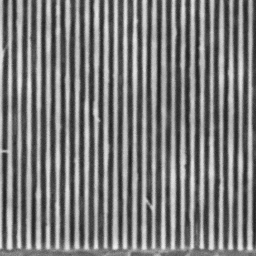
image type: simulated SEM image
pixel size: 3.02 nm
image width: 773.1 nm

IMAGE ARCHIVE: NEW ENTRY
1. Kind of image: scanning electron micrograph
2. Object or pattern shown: parallel lines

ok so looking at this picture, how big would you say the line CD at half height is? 11.3 nm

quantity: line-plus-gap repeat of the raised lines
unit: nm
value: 29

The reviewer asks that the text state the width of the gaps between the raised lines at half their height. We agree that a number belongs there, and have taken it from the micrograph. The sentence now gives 17 nanometers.